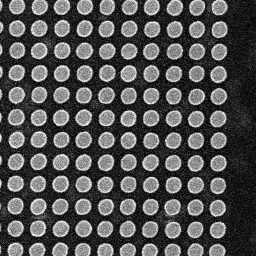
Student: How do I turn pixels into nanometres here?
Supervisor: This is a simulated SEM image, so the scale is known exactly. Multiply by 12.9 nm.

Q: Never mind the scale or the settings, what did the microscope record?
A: a regular array of raised bodies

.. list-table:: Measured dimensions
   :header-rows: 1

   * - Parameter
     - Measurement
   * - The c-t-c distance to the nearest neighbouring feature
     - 284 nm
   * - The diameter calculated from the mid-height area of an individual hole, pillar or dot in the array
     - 201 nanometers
